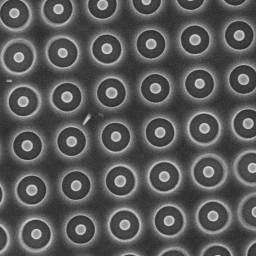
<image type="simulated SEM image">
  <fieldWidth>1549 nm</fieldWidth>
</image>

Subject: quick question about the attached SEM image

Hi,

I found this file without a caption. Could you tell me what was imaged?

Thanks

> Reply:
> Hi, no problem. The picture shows an array of small figures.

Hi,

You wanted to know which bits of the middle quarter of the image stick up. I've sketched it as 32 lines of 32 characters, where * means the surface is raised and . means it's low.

..******************************
********************************
**********************.********.
***********..*******.....******.
*********.....******......****..
...******......****...**...***..
....****...**...***...**..*****.
**..****...**...****......*****.
**..****.......*****......******
*...*****......*******..********
....******...*******************
...*****************************
********************************
***********************..*******
*********************......*****
***********....******......****.
....******......****...**...***.
.....****...**..****...**...***.
.**..****...**...****......*****
.**...****......*****......*****
.*...*****......******....******
.....******....*****************
....****************************
********************************
************************..******
*************..*******......****
************.....*****......****
*....******......****...**...***
......*****..**...***...**...***
..**...***...**...***........***
..**...****..**...****......****
..*....****......******....*****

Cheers